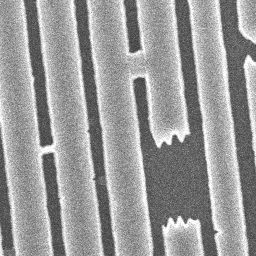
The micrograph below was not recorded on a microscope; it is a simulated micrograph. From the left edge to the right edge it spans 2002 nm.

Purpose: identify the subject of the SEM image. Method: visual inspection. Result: parallel lines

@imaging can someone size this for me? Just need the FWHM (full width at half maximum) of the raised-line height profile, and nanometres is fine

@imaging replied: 282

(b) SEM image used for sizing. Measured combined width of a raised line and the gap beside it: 0.384 microns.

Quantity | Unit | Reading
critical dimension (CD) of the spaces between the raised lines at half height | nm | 106